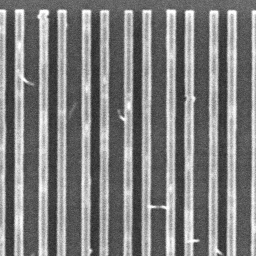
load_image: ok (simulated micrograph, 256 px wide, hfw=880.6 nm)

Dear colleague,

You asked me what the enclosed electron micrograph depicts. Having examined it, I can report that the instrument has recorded parallel lines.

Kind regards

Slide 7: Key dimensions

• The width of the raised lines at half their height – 25.8 nm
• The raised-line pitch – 73.1 nanometers